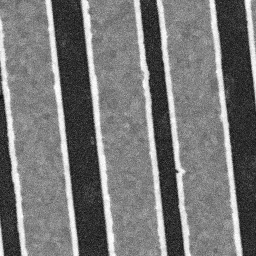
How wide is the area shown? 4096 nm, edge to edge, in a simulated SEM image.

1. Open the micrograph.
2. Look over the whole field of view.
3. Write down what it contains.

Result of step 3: one or a few lines or trenches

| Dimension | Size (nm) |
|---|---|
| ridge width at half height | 817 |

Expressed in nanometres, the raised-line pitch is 1290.